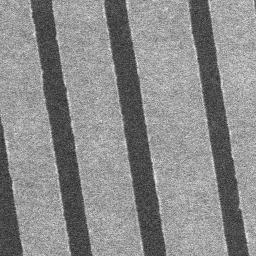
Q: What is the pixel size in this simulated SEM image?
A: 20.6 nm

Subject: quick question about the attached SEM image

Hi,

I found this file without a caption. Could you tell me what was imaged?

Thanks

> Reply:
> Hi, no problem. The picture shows one or a few lines or trenches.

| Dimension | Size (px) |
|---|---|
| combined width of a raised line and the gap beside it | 76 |